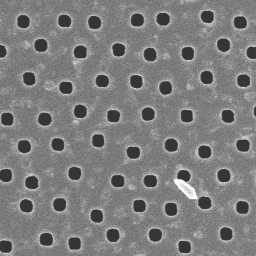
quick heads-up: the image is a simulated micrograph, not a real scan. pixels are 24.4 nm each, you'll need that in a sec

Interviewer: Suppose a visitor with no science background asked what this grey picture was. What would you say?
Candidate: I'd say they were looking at a regular array of holes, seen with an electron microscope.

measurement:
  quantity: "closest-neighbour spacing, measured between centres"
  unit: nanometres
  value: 741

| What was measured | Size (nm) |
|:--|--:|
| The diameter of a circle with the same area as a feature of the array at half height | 335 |